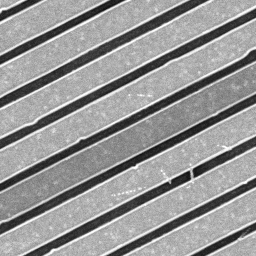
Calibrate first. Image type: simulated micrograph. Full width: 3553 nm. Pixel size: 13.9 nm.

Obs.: parallel lines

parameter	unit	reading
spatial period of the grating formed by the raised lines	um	0.525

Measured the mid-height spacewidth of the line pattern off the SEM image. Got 136 nanometres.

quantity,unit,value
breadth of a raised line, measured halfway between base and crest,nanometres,393